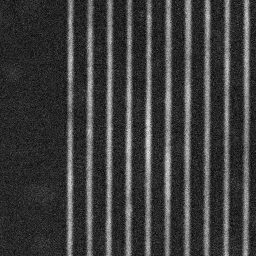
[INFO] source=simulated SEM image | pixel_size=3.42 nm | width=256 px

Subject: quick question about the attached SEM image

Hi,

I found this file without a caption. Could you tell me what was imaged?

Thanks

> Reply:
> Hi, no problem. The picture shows parallel lines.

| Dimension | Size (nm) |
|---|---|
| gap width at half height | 54.3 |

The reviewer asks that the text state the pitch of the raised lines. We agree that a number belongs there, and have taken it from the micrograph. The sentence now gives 66.8 nm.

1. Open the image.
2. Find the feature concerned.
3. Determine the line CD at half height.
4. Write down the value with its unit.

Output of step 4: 12.8 nm